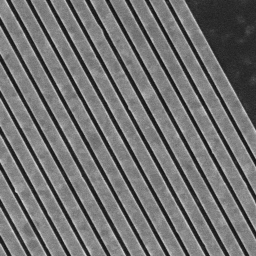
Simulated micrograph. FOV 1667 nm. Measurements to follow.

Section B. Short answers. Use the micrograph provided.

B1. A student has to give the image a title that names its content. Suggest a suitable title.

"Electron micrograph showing parallel lines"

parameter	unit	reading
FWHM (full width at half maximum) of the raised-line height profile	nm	84.2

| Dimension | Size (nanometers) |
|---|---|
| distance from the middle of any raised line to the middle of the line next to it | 113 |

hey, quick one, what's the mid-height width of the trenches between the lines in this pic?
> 0.0278 um